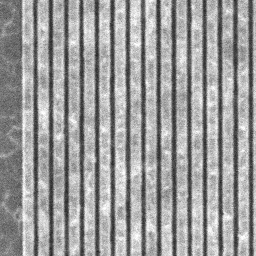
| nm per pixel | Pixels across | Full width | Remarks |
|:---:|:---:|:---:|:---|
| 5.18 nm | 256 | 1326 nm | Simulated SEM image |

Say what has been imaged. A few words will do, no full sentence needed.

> parallel lines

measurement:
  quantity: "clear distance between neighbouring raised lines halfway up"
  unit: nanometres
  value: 33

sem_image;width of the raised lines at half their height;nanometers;47.9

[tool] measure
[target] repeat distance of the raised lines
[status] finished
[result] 79.7 nm